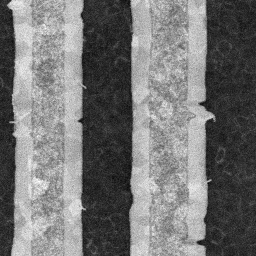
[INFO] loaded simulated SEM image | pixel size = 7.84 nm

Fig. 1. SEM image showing one or a few lines or trenches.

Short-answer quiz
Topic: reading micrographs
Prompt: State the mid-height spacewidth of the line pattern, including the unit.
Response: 0.545 microns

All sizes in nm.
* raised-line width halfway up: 402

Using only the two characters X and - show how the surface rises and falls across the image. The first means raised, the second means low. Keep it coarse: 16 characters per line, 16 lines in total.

-XXXX----XXX----
-XXX-----XXX----
--XXX----XXX----
--XXX----XXX----
-XXX-----XXX----
-XXXX----XXX----
-XXXX----XXX----
--XXX----XXX----
--XXX----XXX----
--XX-----XXX----
--XX-----XXX----
-XXX-----XXX----
-XXX-----XXX----
-XXX-----XXX----
--XX-----XXX----
--XX-----XXX----